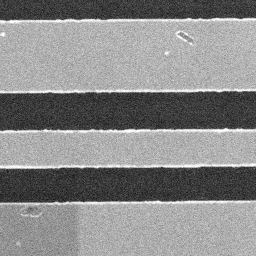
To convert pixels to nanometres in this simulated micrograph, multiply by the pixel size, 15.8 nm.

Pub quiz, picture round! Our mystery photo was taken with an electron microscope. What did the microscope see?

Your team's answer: lines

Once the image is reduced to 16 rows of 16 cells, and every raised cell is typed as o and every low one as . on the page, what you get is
................
oooooooooooooooo
oooooooooooooooo
oooooooooooooooo
oooooooooooooooo
oooooooooooooooo
................
................
oooooooooooooooo
oooooooooooooooo
................
................
................
oooooooooooooooo
oooooooooooooooo
oooooooooooooooo